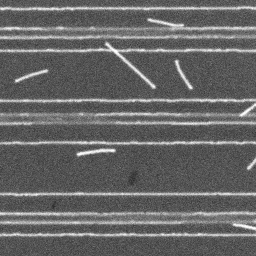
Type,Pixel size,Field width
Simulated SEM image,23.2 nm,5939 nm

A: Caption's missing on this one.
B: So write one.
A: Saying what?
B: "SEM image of lines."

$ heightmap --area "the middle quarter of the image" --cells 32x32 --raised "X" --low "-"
XXXXXXXXXXXXXXXXXXXXXXXXXXXXXXXX
XXXXXXXXXXXXXXXXXXXXXXXXXXXXXXXX
XXXXXXXXXXXXXXXXXXXXXXXXXXXXXXXX
XXXXXXXXXXXXXXXXXXXXXXXXXXXXXXXX
XXXXXXXXXXXXXXXXXXXXXXXXXXXXXXXX
XXXXXXXXXXXXXXXXXXXXXXXXXXXXXXXX
XXXXXXXXXXXXXXXXXXXXXXXXXXXXXXXX
XXXXXXXXXXXXXXXXXXXXXXXXXXXXXXXX
XXXXXXXXXXXXXXXXXXXXXXXXXXXXXXXX
--------------------------------
--------------------------------
--------------------------------
--------------------------------
XXXXXXXXXXXXXXXXXXXXXXXXXXXXXXXX
XXXXXXXXXXXXXXXXXXXXXXXXXXXXXXXX
--------------------------------
--------------------------------
--------------------------------
--------------------------------
--------------------------------
XXXXXXXXXXXXXXXXXXXXXXXXXXXXXXXX
XXXXXXXXXXXXXXXXXXXXXXXXXXXXXXXX
XXXXXXXXXXXXXXXXXXXXXXXXXXXXXXXX
XXXXXXXXXXXXXXXXXXXXXXXXXXXXXXXX
XXXXXXXXXXXXXXXXXXXXXXXXXXXXXXXX
XXXXXXXXXXXXXXXXXXXXXXXXXXXXXXXX
XXXXXXXXXXXXXXXXXXXXXXXXXXXXXXXX
XXXXXXXXXXXXXXXXXXXXXXXXXXXXXXXX
XXXXXXXXXXXXXXXXXXXXXXXXXXXXXXXX
XXXXXXXXXXXXXXXXXXXXXXXXXXXXXXXX
XXXXXXXXXXXXXXXXXXXXXXXXXXXXXXXX
XXXXXXXXXXXXXXXXXXXXXXXXXXXXXXXX